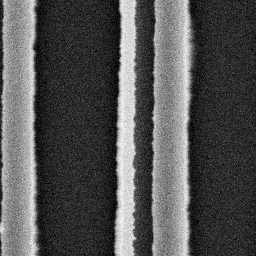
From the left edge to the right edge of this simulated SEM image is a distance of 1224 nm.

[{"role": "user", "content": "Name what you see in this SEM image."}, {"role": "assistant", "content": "lines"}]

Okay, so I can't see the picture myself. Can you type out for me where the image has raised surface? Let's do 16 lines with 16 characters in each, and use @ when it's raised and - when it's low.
@@------@@@@----
@@------@@@@----
@@------@@@@----
@@------@@@@----
@@------@@@@----
@@------@@@@----
@@------@@@@----
@@------@@@@----
@@------@@@@----
@@-----@@@@@----
@@-----@@@@@----
@@------@@@@----
@@-----@@@@@----
@@-----@@@@@----
@@-----@@@@@----
@@-----@@@@@----